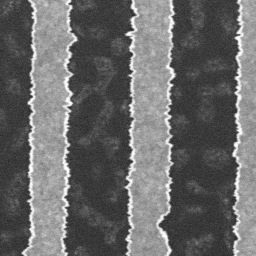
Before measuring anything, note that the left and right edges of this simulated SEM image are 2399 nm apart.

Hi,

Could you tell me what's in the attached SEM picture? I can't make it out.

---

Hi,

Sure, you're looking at one or a few lines or trenches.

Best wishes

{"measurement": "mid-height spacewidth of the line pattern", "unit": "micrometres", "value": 0.619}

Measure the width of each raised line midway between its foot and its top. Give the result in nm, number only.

344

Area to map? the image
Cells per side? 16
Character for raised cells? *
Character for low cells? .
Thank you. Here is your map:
..**....***....*
..**....***....*
..***...***....*
..**....***....*
..**....***....*
..**....***....*
..**....***....*
..**....**.....*
..**....***....*
..**....***....*
..**....***....*
..**....***....*
..**....***....*
..**....**.....*
..**....**.....*
..**....**.....*